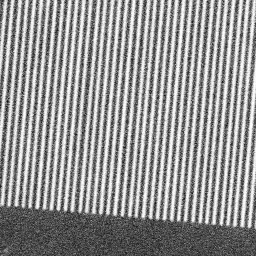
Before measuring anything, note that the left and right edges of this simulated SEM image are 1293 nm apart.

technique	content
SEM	parallel lines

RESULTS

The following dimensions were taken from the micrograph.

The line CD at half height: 1.74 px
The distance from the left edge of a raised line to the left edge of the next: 35.8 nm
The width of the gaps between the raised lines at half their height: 25.8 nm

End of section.